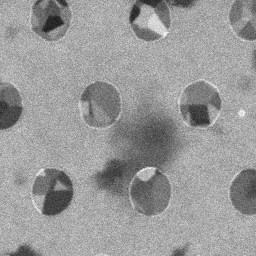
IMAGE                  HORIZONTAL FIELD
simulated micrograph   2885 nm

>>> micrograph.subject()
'raised bodies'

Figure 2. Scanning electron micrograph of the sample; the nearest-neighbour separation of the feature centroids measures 1110 nanometers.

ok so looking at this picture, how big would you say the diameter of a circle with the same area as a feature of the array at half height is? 0.519 micrometres